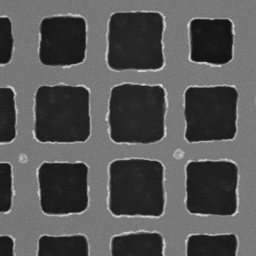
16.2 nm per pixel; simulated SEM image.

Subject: a regular array of holes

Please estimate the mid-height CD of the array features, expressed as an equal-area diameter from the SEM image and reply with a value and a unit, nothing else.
58.6 px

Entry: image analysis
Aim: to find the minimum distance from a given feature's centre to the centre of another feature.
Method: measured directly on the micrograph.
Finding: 1180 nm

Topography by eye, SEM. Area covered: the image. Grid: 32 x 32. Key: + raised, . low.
++++++++++++++++++++++++++++++++
++++++++++++++++...+++++++++++++
.++++......+++......++++....++++
..+++......+++......++++.....+++
..+++......+++......++++.....+++
..+++......+++......++++.....+++
.++++......++.......++++.....+++
.++++.....+++.......++++.....+++
++++++++++++++......++++++++++++
++++++++++++++++++++++++++++++++
++++++++++++++++++++++++++++++++
..+++......+++.......++.......++
..++.......+++.......++.......++
..++.......+++.......++.......++
..++.......+++.......++.......++
..++.......+++......+++.......++
..++.......+++......+++......+++
.++++......+++......++++...+++++
++++++++++++++++++++++++++++++++
++++++++++++++++++++++++++++++++
.++++.....++++......++++.....+++
.++++......+++......+++.......++
.++++......+++......+++.......++
.++++......+++......+++.......++
.++++......+++......+++.......++
.++++......+++.......++.......++
++++++....++++......++++.....+++
++++++++++++++++++++++++++++++++
++++++++++++++++++++++++++++++++
.++++.+++.+++++.....++++.....+++
..+++......+++......+++.......++
..+++......+++......+++......+++